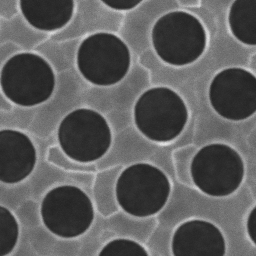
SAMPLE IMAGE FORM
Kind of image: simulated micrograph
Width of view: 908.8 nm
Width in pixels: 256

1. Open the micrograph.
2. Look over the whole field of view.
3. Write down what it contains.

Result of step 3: holes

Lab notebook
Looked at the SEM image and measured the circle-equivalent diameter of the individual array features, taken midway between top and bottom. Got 188 nm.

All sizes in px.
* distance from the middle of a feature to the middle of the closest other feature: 78.1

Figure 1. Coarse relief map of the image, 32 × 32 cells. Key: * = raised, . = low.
***......****....************...
***......*************.******...
***......***********.....****...
****...************......****...
***********...*****.......***...
**********......***.......*****.
**********......****.....*******
*.....****......****....********
......****......****************
.......***......***********.....
.......*****..************......
......************....****......
*.....***********......***......
*****************......****.....
********.....****......*****...*
********.....****......*********
..*****.......****.....*********
....***.......*****..***********
....****......***********....***
....*****....***********......**
....*************.******......**
....***********.....****......**
...************......***......**
*******...*****......****.....**
******.....****......******.****
*****......****......***********
.****.......****....***********.
..***.......*******************.
..****.....***********.....****.
..*****...************......***.
..***********....*****......****
.************.....****......****